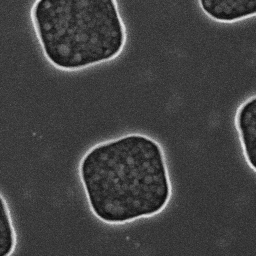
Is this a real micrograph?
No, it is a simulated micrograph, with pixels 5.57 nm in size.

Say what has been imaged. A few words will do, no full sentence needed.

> holes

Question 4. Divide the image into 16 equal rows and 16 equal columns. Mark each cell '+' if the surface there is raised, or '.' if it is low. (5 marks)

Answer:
++.....++++++...
++......++++++++
+++.....++++++++
+++....+++++++++
++++++++++++++++
++++++++++++++++
+++++++++++++++.
+++++++++++++++.
++++++++.++++++.
++++++....+++++.
+++++.....++++++
+++++.....++++++
++++++....++++++
++++++...+++++++
.+++++++++++++++
.+++++++++++++++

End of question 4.